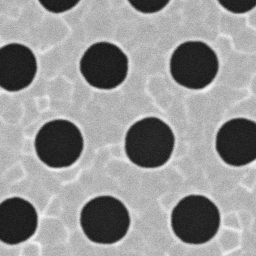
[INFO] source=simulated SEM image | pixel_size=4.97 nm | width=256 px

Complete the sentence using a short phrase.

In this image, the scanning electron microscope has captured holes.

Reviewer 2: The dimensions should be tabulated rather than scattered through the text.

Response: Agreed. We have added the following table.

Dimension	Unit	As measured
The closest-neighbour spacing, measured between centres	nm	444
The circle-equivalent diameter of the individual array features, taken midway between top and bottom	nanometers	246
